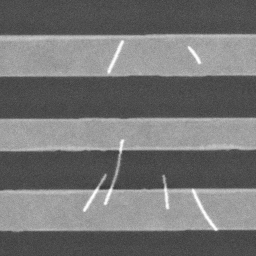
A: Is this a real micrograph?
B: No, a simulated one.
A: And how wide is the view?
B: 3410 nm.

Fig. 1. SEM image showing lines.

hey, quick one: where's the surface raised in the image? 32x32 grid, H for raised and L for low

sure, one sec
LLLLLLLLLLLLLLLLLLLLLLLLLLLLLLLL
LLLLLLLLLLLLLLLLLLLLLLLLLLLLLLLL
LLLLLLLLLLLLLLLLLLLLLLLLLLLLLLLL
LLLLLLLLLLLLLLLLLLLLLLLLLLLLLLLL
LLLHHHHHHHHHHHHHHHHHHHHHHHHHHHHH
HHHHHHHHHHHHHHHHHHHHHHHHHHHHHHHH
HHHHHHHHHHHHHHHHHHHHHHHHHHHHHHHH
HHHHHHHHHHHHHHHHHHHHHHHHHHHHHHHH
HHHHHHHHHHHHHHHHHHHHHHHHHHHHHHHH
LLLLLLLLLLLLLLLLLLLLLLLLLLLLLLLL
LLLLLLLLLLLLLLLLLLLLLLLLLLLLLLLL
LLLLLLLLLLLLLLLLLLLLLLLLLLLLLLLL
LLLLLLLLLLLLLLLLLLLLLLLLLLLLLLLL
LLLLLLLLLLLLLLLLLLLLLLLLLLLLLLLL
LLLLLLLLLLLLLLLLLLLLLLLLLLLLLLLL
HHHHHHHHHHHHHHHHHHHHHHHHHHHHHHHH
HHHHHHHHHHHHHHHHHHHHHHHHHHHHHHHH
HHHHHHHHHHHHHHHHHHHHHHHHHHHHHHHH
HHHHHHHHHHHHHHHHHHHHHHHHHHHHHHHH
LLLLLLLLLLLLLLLLLLLLLLLLLLLLLLLL
LLLLLLLLLLLLLLLLLLLLLLLLLLLLLLLL
LLLLLLLLLLLLLLLLLLLLLLLLLLLLLLLL
LLLLLLLLLLLLLLLLLLLLLLLLLLLLLLLL
LLLLLLLLLLLLLLLLLLLLLLLLLLLLLLLL
HHHHHHHHHHHHHHHHHHHHHHHHHHHHHHHH
HHHHHHHHHHHHHHHHHHHHHHHHHHHHHHHH
HHHHHHHHHHHHHHHHHHHHHHHHHHHHHHHH
HHHHHHHHHHHHHHHHHHHHHHHHHHHHHHHH
HHHHHHHHHHHHHHHHHHHHHHHHHHHHHHHH
LLLLLLLLLLLLLLLLLLLLLLLLLLLLLLLL
LLLLLLLLLLLLLLLLLLLLLLLLLLLLLLLL
LLLLLLLLLLLLLLLLLLLLLLLLLLLLLLLL